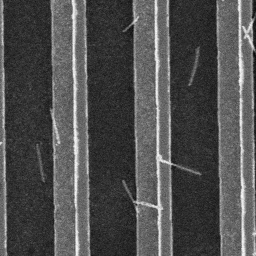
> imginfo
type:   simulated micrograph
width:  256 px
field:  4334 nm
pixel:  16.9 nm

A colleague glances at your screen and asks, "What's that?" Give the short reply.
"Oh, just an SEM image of lines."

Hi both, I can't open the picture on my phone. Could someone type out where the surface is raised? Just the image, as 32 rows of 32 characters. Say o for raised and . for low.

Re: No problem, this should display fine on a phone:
.......oooo......oooo......oooo.
.......oooo......oooo......oooo.
.......oooo......oooo......ooooo
.......oooo......oooo......ooooo
.......oooo......oooo......ooooo
.......oooo......oooo......ooooo
.......oooo......oooo......ooooo
.......oooo......oooo......ooooo
.......oooo......oooo......ooooo
.......oooo......oooo......ooooo
.......oooo......oooo......ooooo
.......oooo......oooo......ooooo
.......oooo......oooo......ooooo
.......oooo......oooo......ooooo
.......oooo......oooo......ooooo
.......oooo......oooo......ooooo
.......oooo......oooo.......oooo
.......oooo......oooo.......oooo
.......oooo......oooo.......oooo
o......oooo......oooo.......oooo
o......oooo......oooo.......oooo
o......oooo......oooo.......oooo
o......oooo......oooo.......oooo
o......oooo......oooo.......oooo
o......oooo......oooo.......oooo
o......oooo......oooo.......oooo
o......oooo......oooo.......oooo
o......oooo......oooo.......oooo
o......oooo......oooo.......oooo
o......oooo......oooo.......oooo
o......oooo......oooo.......oooo
o......oooo......oooo.......oooo